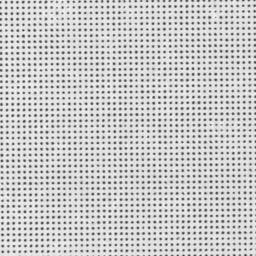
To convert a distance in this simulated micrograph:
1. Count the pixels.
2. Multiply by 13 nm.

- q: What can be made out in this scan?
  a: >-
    a regular array of holes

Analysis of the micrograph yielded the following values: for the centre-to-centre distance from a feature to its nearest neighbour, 66.8 nm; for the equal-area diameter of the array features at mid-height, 0.0387 microns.